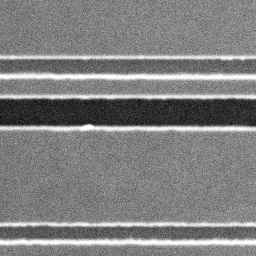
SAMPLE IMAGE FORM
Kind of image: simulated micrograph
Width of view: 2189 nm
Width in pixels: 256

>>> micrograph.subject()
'lines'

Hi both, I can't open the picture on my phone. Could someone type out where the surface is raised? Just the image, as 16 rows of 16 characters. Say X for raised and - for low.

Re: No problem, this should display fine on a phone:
XXXXXXXXXXXXXXXX
XXXXXXXXXXXXXXXX
XXXXXXXXXXXXXXXX
XXXXXXXXXXXXXXXX
XXXXXXXXXXXXXXXX
XXXXXXXXXXXXXXXX
----------------
----------------
XXXXXXXXXXXXXXXX
XXXXXXXXXXXXXXXX
XXXXXXXXXXXXXXXX
XXXXXXXXXXXXXXXX
XXXXXXXXXXXXXXXX
XXXXXXXXXXXXXXXX
XXXXXXXXXXXXXXXX
XXXXXXXXXXXXXXXX